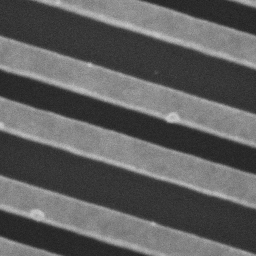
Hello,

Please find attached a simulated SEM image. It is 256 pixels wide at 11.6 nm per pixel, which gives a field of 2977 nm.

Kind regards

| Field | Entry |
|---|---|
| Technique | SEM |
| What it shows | lines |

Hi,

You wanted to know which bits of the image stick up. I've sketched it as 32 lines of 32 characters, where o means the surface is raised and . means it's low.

......ooooooooooooo...........oo
.........ooooooooooooo..........
............oooooooooooooo......
...............oooooooooooooo...
...................ooooooooooooo
ooo...................oooooooooo
oooooo...................ooooooo
oooooooooo..................oooo
ooooooooooooo..................o
...ooooooooooooo................
......ooooooooooooo.............
.........oooooooooooooo.........
o...........oooooooooooooo......
oooo............ooooooooooooo...
oooooooo...........ooooooooooooo
ooooooooooo...........oooooooooo
.ooooooooooooo............oooooo
....oooooooooooooo...........ooo
.......oooooooooooooo...........
..........oooooooooooooo........
..............ooooooooooooo.....
.................ooooooooooooo..
oo..................oooooooooooo
ooooo...................oooooooo
oooooooo...................ooooo
ooooooooooo...................oo
.oooooooooooooo.................
....oooooooooooooo..............
........ooooooooooooo...........
...........ooooooooooooo........
ooo...........oooooooooooooo....
oooooo...........oooooooooooooo.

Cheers